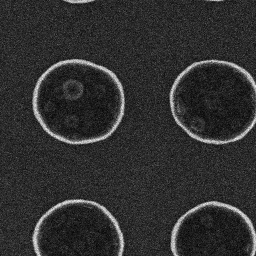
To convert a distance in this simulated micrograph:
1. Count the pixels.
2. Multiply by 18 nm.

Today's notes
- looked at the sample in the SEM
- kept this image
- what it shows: raised bodies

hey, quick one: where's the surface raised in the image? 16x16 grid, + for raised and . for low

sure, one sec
................
................
................
................
...++++.....+++.
..++++++...+++++
..++++++...+++++
..+++++....+++++
...++++.....+++.
................
................
................
................
...++++.....+++.
..+++++....+++++
..++++++...+++++